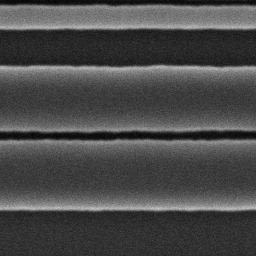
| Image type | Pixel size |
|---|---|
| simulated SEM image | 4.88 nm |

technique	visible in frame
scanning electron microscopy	lines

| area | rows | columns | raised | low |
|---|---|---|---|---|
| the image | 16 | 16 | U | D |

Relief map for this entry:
UUUUUUUUUUUUUUUU
UUUUUUUUUUUUUUUU
DDDDDDDDDDDDDDDD
DDDDDDDDDDDDDDDD
UUUUUUUUUUUUUUUU
UUUUUUUUUUUUUUUU
UUUUUUUUUUUUUUUU
UUUUUUUUUUUUUUUU
UUUUUUUUUUUUUUUU
UUUUUUUUUUUUUUUU
UUUUUUUUUUUUUUUU
UUUUUUUUUUUUUUUU
UUUUUUUUUUUUUUUU
DDDDDDDDDDDDDDDD
DDDDDDDDDDDDDDDD
DDDDDDDDDDDDDDDD